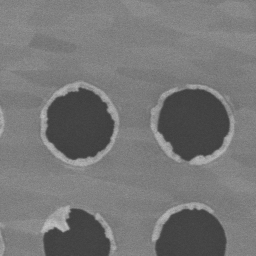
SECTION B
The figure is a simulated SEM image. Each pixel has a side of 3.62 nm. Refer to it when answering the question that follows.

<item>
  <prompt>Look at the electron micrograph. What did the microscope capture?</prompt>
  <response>holes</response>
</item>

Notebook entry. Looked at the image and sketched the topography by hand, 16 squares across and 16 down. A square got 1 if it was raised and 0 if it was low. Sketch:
1111111111111111
1111111111111111
1111111111111111
1111111111111111
1111111111111111
1111111111111111
1110000111000011
1110000111000011
1110000111000011
1111001111100111
1111111111111111
1111111111111111
1111111111111111
1111001111100111
1110000111000011
1110000111000011